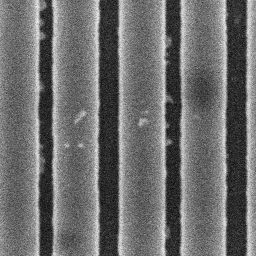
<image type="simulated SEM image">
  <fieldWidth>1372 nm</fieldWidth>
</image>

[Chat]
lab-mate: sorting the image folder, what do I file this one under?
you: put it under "lines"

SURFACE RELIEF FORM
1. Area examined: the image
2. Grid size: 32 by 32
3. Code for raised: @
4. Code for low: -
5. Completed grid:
@@@@@--@@@@@---@@@@@@--@@@@@---@
@@@@@--@@@@@---@@@@@@--@@@@@---@
@@@@@--@@@@@---@@@@@@--@@@@@---@
@@@@@--@@@@@---@@@@@@--@@@@@---@
@@@@@--@@@@@---@@@@@@--@@@@@---@
@@@@@--@@@@@---@@@@@@--@@@@@---@
@@@@@--@@@@@---@@@@@@--@@@@@---@
@@@@@--@@@@@---@@@@@@--@@@@@---@
@@@@@--@@@@@---@@@@@@--@@@@@---@
@@@@@--@@@@@---@@@@@@--@@@@@---@
@@@@@--@@@@@---@@@@@@--@@@@@---@
@@@@@--@@@@@---@@@@@@--@@@@@---@
@@@@@--@@@@@---@@@@@@--@@@@@---@
@@@@@--@@@@@---@@@@@@--@@@@@---@
@@@@@--@@@@@---@@@@@@--@@@@@---@
@@@@@--@@@@@---@@@@@@--@@@@@---@
@@@@@--@@@@@---@@@@@@--@@@@@---@
@@@@@--@@@@@---@@@@@@--@@@@@---@
@@@@@--@@@@@---@@@@@@--@@@@@---@
@@@@@--@@@@@---@@@@@@--@@@@@---@
@@@@@--@@@@@---@@@@@@--@@@@@---@
@@@@@--@@@@@---@@@@@@--@@@@@---@
@@@@@--@@@@@---@@@@@@--@@@@@---@
@@@@@--@@@@@---@@@@@@--@@@@@---@
@@@@@--@@@@@---@@@@@@--@@@@@---@
@@@@@--@@@@@---@@@@@@--@@@@@---@
@@@@@--@@@@@---@@@@@@--@@@@@---@
@@@@@--@@@@@---@@@@@@--@@@@@---@
@@@@@--@@@@@---@@@@@@--@@@@@---@
@@@@@--@@@@@---@@@@@@--@@@@@---@
@@@@@--@@@@@---@@@@@@--@@@@@---@
@@@@@--@@@@@---@@@@@@--@@@@@---@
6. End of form